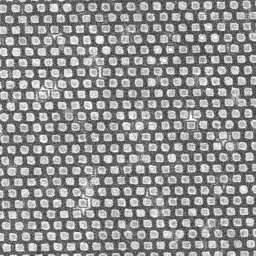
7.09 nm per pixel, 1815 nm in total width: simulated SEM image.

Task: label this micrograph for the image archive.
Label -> a regular array of raised bodies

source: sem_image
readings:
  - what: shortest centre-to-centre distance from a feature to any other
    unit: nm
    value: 87.6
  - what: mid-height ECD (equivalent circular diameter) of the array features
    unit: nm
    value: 53.6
